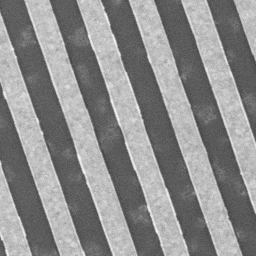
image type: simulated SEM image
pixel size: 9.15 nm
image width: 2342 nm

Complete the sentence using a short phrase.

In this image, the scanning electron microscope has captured parallel lines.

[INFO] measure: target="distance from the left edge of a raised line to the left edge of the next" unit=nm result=454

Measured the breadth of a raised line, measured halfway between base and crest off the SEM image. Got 200 nm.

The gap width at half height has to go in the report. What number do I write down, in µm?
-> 0.253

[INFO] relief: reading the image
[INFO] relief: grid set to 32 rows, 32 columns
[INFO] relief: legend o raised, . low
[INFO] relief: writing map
...ooo....ooo...ooo....ooo...ooo
....ooo...ooo....ooo...ooo....oo
....ooo....oo....ooo....ooo...oo
o...ooo....ooo...ooo....ooo...oo
o....ooo...ooo....ooo...ooo....o
o....ooo...ooo....ooo....ooo...o
oo...ooo....ooo...ooo....ooo....
oo....ooo...ooo....ooo...ooo....
oo....ooo....ooo...ooo....ooo...
ooo...ooo....ooo....oo....ooo...
ooo....ooo...ooo....ooo...ooo...
ooo....ooo....ooo...ooo....ooo..
.ooo...ooo....ooo....oo....ooo..
.ooo....ooo...ooo....ooo...ooo..
..ooo...ooo....ooo...ooo....ooo.
..ooo....oo....ooo....oo....ooo.
..ooo....ooo...ooo....ooo...ooo.
...ooo...ooo....ooo...ooo....ooo
...ooo....oo....ooo....ooo...ooo
...ooo....ooo...ooo....ooo....oo
....oo....ooo....ooo...ooo....oo
....ooo...ooo....ooo....ooo...oo
o...ooo....ooo...ooo....ooo....o
o....ooo...ooo....ooo...ooo....o
o....ooo....ooo...ooo....ooo...o
oo...ooo....ooo...ooo....ooo....
oo....ooo...ooo....ooo...ooo....
oo....ooo....ooo...ooo....ooo...
ooo...ooo....ooo...ooo....ooo...
ooo....ooo...ooo....ooo...ooo...
ooo....ooo....ooo...ooo....ooo..
.ooo...ooo....ooo...ooo....ooo..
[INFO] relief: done